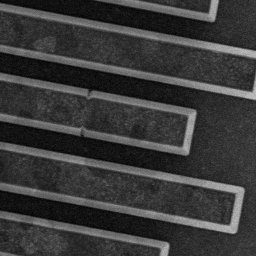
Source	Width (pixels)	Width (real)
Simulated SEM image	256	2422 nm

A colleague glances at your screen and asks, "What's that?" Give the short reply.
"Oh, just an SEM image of one or a few lines or trenches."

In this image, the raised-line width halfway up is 385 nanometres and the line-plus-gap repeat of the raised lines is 67.8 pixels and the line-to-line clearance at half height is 266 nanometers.